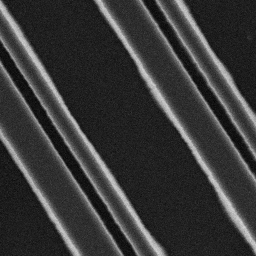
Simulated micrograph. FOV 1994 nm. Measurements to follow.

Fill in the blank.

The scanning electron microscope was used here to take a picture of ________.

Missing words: lines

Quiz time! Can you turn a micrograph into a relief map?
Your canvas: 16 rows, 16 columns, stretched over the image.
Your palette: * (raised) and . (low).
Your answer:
......*****.....
*......*****....
*.......*****...
**......*****...
***......*****..
***.......*****.
****......*****.
*****......*****
*****.......****
.*****......****
.*****.......***
..*****......***
...*****......**
...*****.......*
....*****......*
.....*****......